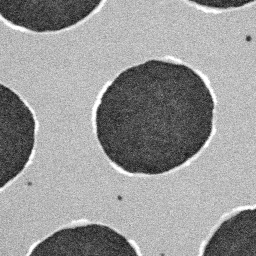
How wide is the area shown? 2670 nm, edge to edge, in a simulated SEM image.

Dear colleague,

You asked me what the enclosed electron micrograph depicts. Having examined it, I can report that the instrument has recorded holes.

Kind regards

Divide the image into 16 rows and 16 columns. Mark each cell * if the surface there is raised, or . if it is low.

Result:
......*******..*
*....***********
****************
****************
********....****
.******......***
..****.......***
..****.......***
..****.......***
..*****.....****
.*******...*****
****************
****************
**************..
***....******...
**......*****...